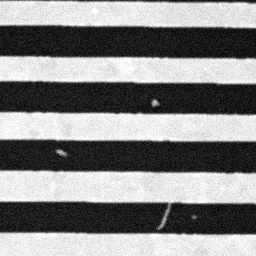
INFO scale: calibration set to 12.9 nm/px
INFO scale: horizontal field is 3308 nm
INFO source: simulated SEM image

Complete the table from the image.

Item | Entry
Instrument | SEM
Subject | lines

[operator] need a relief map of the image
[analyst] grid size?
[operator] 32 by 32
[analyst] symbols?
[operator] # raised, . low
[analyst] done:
###############################.
################################
################################
................................
................................
................................
................................
################################
################################
################################
................................
................................
................................
................................
################################
################################
################################
...................#############
................................
................................
................................
########........................
################################
################################
################################
................................
................................
................................
................................
################################
################################
################################